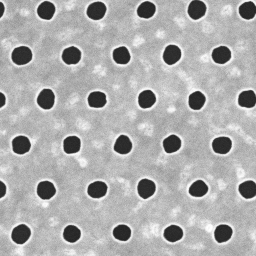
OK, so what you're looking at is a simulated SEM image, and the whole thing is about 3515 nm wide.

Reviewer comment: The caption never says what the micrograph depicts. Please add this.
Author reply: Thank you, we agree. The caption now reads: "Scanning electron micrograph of a regular array of holes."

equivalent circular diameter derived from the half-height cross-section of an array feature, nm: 258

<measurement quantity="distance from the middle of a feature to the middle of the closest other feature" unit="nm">682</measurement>